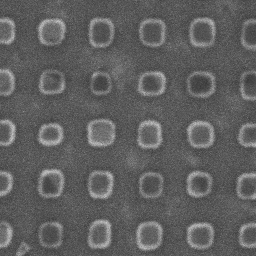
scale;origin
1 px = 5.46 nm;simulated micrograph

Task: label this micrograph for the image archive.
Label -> a regular array of raised bodies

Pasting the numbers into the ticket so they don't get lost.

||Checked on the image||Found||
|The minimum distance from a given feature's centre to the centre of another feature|267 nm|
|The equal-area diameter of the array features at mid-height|136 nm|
